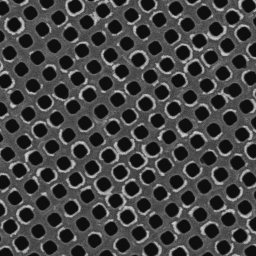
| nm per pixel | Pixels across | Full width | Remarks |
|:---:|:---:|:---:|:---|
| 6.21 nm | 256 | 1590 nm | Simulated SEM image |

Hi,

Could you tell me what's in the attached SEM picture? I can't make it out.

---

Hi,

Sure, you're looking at a regular array of holes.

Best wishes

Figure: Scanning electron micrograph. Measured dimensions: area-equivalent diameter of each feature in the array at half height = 83.2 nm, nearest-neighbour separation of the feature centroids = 124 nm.